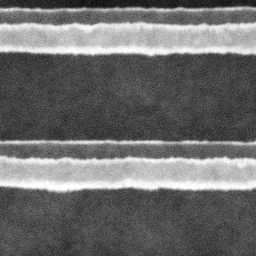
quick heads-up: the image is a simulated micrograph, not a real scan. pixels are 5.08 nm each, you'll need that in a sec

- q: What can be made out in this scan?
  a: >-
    lines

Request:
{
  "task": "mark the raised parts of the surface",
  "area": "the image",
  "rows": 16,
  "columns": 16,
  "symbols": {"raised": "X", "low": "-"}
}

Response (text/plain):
----------------
XXXXXXXXXXXXXXXX
XXXXXXXXXXXXXXXX
----------------
----------------
----------------
----------------
----------------
----------------
XXXXXXXXXXXXXXXX
XXXXXXXXXXXXXXXX
XXXXXXXXXXXXXXXX
----------------
----------------
----------------
----------------